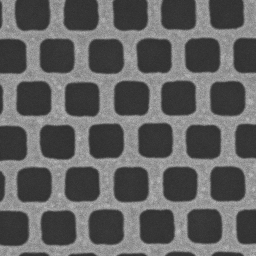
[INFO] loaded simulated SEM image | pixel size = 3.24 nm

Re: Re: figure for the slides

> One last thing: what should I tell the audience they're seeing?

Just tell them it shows a regular array of holes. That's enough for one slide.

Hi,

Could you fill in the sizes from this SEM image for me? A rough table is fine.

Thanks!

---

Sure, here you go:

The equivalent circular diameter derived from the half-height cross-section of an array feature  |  122 nanometres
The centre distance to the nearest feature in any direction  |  0.155 micrometres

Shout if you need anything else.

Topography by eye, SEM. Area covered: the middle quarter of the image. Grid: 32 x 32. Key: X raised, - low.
---XXX---------XXXX--------XXX--
--XXXXX-------XXXXX-------XXXXX-
XXXXXXXXXX--XXXXXXXXXXXXXXXXXXXX
XXXXXXXXXXXXXXXXXXXXXXXXXXXXXXXX
XXXXXXXXXXXXXX------XXXXXX------
X--------XXXX--------XXXX-------
---------XXXX--------XXX--------
---------XXXX--------XXX--------
---------XXXX--------XXX--------
---------XXXX--------XXX--------
---------XXXX--------XXX--------
---------XXXX--------XXX--------
X-------XXXXX-------XXXXX-------
XXXXXXXXXXXXXXXXXXXXXXXXXXXXXXXX
XXXXXXXXXXXXXXXXXXXXXXXXXXXXXXXX
--XXXXX-------XXXXX--------XXXXX
---XXX---------XXXX--------XXXX-
---XXX---------XXX---------XXX--
---XXX---------XXX---------XXX--
---XXX---------XXX---------XXX--
---XXX---------XXX---------XXXX-
---XXX---------XXX---------XXXX-
---XXXX-------XXXXX--------XXXX-
--XXXXXX-----XXXXXXXX----XXXXXXX
XXXXXXXXXXXXXXXXXXXXXXXXXXXXXXXX
XXXXXXXXXXXXXXXXXXXXXXXXXXXXXXXX
X-------XXXXX--------XXXX-------
---------XXXX--------XXXX-------
---------XXX---------XXXX-------
---------XXX---------XXXX-------
---------XXX---------XXXX-------
---------XXX---------XXXX-------